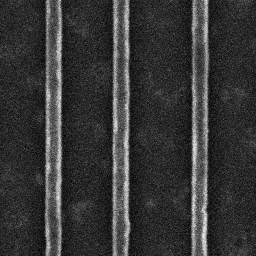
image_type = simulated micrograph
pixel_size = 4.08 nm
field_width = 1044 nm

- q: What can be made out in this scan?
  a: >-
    one or a few lines or trenches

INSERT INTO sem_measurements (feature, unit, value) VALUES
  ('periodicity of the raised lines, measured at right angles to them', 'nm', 299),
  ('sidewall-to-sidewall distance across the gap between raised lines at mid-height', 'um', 0.24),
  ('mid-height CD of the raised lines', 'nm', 58.6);